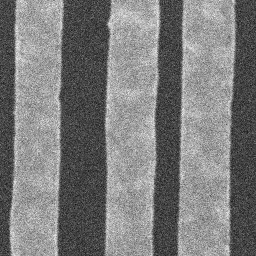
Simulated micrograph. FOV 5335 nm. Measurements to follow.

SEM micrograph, one or a few lines or trenches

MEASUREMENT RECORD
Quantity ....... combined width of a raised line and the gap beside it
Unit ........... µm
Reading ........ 1.76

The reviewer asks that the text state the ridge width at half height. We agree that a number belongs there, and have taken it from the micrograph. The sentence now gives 46.5 pixels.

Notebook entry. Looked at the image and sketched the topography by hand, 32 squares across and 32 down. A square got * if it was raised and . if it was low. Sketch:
..******......******...******...
..******......******...******...
..******......**.***...******...
..******......******...******...
..******......******...******...
..******......******...******...
..******......******...******...
..******......******...******...
..******......******...******...
..*****.......******...******...
..*****.......******...******...
..*****.......*****....******...
..*****......******....******...
..*****......******....******...
..*****......******....******...
..*****......******....******...
..*****......******....******...
..*****......******....******...
..*****......******....******...
..*****......******....******...
..*****.......*****....******...
..*****.......*****....******...
..*****......******....******...
..*****.......*****....******...
..*****......******....******...
..*****......******....******...
..*****......******...******....
.******......******...*******...
.******......******...*******...
.******......******...*******...
.******......******...*******...
..*****......******...*******...